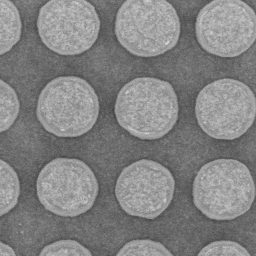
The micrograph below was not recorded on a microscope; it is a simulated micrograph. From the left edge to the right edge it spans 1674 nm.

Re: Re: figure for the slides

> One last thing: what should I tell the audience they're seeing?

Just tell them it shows raised bodies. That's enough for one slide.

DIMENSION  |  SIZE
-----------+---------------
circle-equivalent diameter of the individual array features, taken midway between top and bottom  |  395 nm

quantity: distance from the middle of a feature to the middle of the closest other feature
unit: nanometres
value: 513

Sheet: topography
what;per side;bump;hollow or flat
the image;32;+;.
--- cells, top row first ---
+.....+++++.....+++++.....+++++.
++...+++++++...+++++++...+++++++
+++..+++++++...+++++++...+++++++
++...+++++++..++++++++...+++++++
++...+++++++...+++++++...+++++++
++....++++++...+++++++...++++++.
.......+++......++++......++++..
................................
................................
................................
+.....+++++.....+++++.....++++..
++...+++++++...+++++++...++++++.
++...+++++++...+++++++...+++++++
++...+++++++..++++++++...+++++++
++...+++++++..++++++++...+++++++
+....+++++++...+++++++...++++++.
......+++++.....+++++.....+++++.
................................
................................
................................
+.....++++.......+++......++++..
++...++++++....++++++....++++++.
++...+++++++...+++++++..++++++++
++...+++++++..++++++++..++++++++
++...+++++++...++++++...++++++++
++...++++++....++++++....++++++.
+......+++......++++.....++++++.
................................
................................
................................
.......+++......++++.......+++..
++...++++++....++++++....++++++.